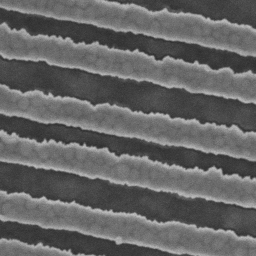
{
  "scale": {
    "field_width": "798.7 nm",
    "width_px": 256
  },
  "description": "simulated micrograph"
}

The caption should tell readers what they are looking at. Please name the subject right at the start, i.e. lines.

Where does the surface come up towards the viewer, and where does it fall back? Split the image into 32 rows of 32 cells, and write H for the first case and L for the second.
HHHHHHHHHHHHHHHLLLLLLLLLLLLLLLLL
LLLHHHHHHHHHHHHHHHHHHLLLLLLLLLLL
LLLLLLLLHHHHHHHHHHHHHHHHHHLLLLLL
HLLLLLLLLLLLLHHHHHHHHHHHHHHHHHHH
HHHHHHLLLLLLLLLLLLLHHHHHHHHHHHHH
HHHHHHHHHHHHHLLLLLLLLLLLLHHHHHHH
HHHHHHHHHHHHHHHHHHLLLLLLLLLLLHHH
LLLHHHHHHHHHHHHHHHHHHHHLLLLLLLLL
LLLLLLLLLLHHHHHHHHHHHHHHHHLLLLLL
LLLLLLLLLLLLLLHHHHHHHHHHHHHHHHHH
LLLLLLLLLLLLLLLLLLLHHHHHHHHHHHHH
HHHHHLLLLLLLLLLLLLLLLLLLHHHHHHHH
HHHHHHHHHHLLLLLLLLLLLLLLLLLLLLHH
HHHHHHHHHHHHHHHHLLLLLLLLLLLLLLLL
LLHHHHHHHHHHHHHHHHHHHLLLLLLLLLLL
LLLLLLLLHHHHHHHHHHHHHHHHHHLLLLLL
HLLLLLLLLLLLLHHHHHHHHHHHHHHHHHLL
HHHHLLLLLLLLLLLLLLHHHHHHHHHHHHHH
HHHHHHHHHHHHLLLLLLLLLLLLHHHHHHHH
HHHHHHHHHHHHHHHHLLLLLLLLLLLLLHHH
LLLHHHHHHHHHHHHHHHHHHLLLLLLLLLLL
LLLLLLLLLHHHHHHHHHHHHHHHHHHHLLLL
LLLLLLLLLLLLLHHHHHHHHHHHHHHHHHHH
LLLLLLLLLLLLLLLLLLLHHHHHHHHHHHHH
HHHHLLLLLLLLLLLLLLLLLLLHHHHHHHHH
HHHHHHHHHHLLLLLLLLLLLLLLLLLLLHHH
HHHHHHHHHHHHHHLLLLLLLLLLLLLLLLLL
HHHHHHHHHHHHHHHHHHHLLLLLLLLLLHLL
LLLLLLHHHHHHHHHHHHHHHHHHHHLLLLLL
LLLLLLLLLLLLHHHHHHHHHHHHHHHHHHLL
HHHLLLLLLLLLLLLLLHHHHHHHHHHHHHHH
HHHHHHHHHLLLLLLLLLLLLHHHHHHHHHHH